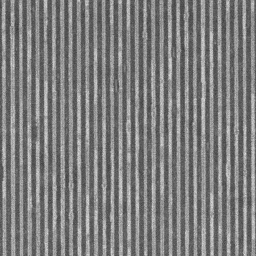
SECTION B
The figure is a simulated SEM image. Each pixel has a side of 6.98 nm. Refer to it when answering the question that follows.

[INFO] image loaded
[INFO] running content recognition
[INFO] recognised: parallel lines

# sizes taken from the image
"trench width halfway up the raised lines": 0.0427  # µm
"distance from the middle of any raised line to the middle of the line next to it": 57.9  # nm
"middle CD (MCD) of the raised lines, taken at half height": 0.0166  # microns